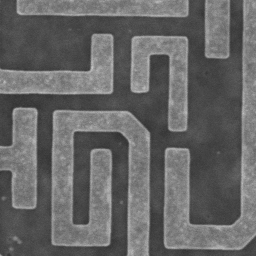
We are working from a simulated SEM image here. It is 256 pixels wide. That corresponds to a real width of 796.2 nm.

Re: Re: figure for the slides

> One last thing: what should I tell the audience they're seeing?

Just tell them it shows wiring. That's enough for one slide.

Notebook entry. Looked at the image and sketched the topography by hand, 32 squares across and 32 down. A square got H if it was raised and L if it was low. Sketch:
LLHHHHHHHHHHHHHHHHHHHHHLLLHHHLLH
LLHHHHHHHHHHHHHHHHHHHHHLLLHHHLLH
LLLLLLLLLLLLLLLLLLLLLLLLLLHHHLLH
LLLLLLLLLLLLLLLLLLLLLLLLLLHHHLHH
LLLLLLLLLLLLHHLLLLLLLLLLLLHHHLHH
LLLLLLLLLLLLHHLLLHHHHHHLLLHHHLHH
LLLLLLLLLLLLHHLLLHHHHHHLLLHHHLHH
LLLLLLLLLLLLHHLLLHHLLHHLLLLLLLHH
LLLLLLLLLLLHHHLLHHHLLHHLLLLLLLHH
HHHHHHHHHHHHHHLLHHLLLHHLLLLLLLHH
HHHHHHHHHHHHHHLLHHLLLHHLLLLLLLHH
HHHHHHHHHHHHHHLLLHLLLHHLLLLLLLHH
LLLLLLLLLLLLLLLLLLLLLHHLLLLLLLHH
LLLLLLLLLLLLLLLLLLLLLHHLLLLLLLHH
LLHHHLLHHHHHHHHHHLLLLHHLLLLLLLHH
LLHHLLLHHHHHHHHHHHLLLHHLLLLLLLHH
LLHHLLLHHLLLLLLHHHLLLLLLLLLLLLHH
LLHHLLLHHLLLLLLLHHHLLLLLLLLLLLHH
HHHHLLLHHLLLLLLLHHHLLLLLLLLLLLHH
HHHHLLLHHLLHHHLLHHHLLHHHLLLLLLHH
HHHHLLLHHLLHHHLLHHHLLHHHLLLLLLHH
LHHHLLLHHLLHHHLLHHHLLHHHLLLLLLHH
LLHHLLLHHLLHHHLLHHHLLHHHLLLLLLHH
LLHHLLLHHLLHHHLLHHHLLHHHLLLLLLHH
LLHHLLLHHLLHHHLLHHHLLHHHLLLLLLHH
LLHHLLLHHLLHHHLLHHHLLHHHLLLLLLHH
LLLLLLLHHLLHHHLLHHHLLHHHLLLLLLHH
LLLLLLLHHLLHHHLLHHHLLHHHLLLLLLHH
LLLLLLLHHHHHHHLLHHHLLHHHHHHHHHHH
LLLLLLLHHHHHHHLLHHLLLHHHHHHHHHHH
LLLLLLLHHHHHHLLLHHLLLHHHHHHHHHHL
LLLLLLLLLLLLLLLLHHLLLLLLLLLLLLLL